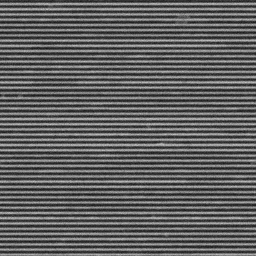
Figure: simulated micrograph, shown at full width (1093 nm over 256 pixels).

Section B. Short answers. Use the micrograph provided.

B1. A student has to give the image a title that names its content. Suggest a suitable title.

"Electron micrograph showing parallel lines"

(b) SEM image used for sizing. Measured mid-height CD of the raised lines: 6.4 nanometers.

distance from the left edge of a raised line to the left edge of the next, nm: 22.3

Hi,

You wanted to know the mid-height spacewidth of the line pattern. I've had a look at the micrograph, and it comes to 15 nanometers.